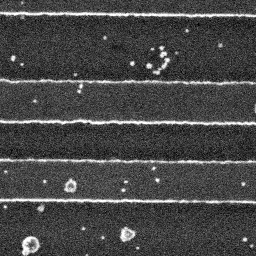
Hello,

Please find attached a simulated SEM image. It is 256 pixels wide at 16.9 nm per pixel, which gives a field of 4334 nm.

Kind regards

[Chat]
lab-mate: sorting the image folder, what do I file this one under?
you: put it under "lines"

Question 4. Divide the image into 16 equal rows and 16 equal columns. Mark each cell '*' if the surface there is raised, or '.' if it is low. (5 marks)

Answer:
****************
................
................
................
................
****************
****************
****************
................
................
****************
****************
****************
................
................
................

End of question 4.